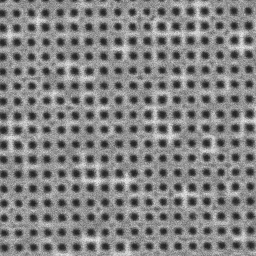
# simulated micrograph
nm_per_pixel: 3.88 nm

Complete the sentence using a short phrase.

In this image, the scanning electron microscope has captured a regular array of holes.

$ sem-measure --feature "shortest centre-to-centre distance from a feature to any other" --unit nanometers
54.7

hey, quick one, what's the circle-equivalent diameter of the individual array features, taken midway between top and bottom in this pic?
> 31.3 nm